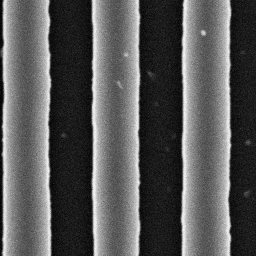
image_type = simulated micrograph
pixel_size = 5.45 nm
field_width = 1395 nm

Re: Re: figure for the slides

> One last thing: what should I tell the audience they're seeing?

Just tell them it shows lines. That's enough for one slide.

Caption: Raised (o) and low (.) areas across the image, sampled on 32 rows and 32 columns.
oooooo......ooooo......oooooo...
oooooo......ooooo......oooooo...
oooooo......ooooo......oooooo...
oooooo......ooooo......oooooo...
oooooo......ooooo......oooooo...
oooooo......ooooo......oooooo...
oooooo......ooooo......oooooo...
oooooo......ooooo......oooooo...
oooooo......ooooo......oooooo...
oooooo......ooooo......oooooo...
oooooo......ooooo......oooooo...
.ooooo......ooooo......oooooo...
.ooooo......ooooo......oooooo...
oooooo......ooooo......oooooo...
oooooo......ooooo......oooooo...
oooooo......ooooo......oooooo...
oooooo......ooooo......oooooo...
oooooo......ooooo......oooooo...
oooooo......ooooo......oooooo...
oooooo......ooooo......oooooo...
oooooo......ooooo......oooooo...
oooooo......ooooo......oooooo...
oooooo......ooooo......oooooo...
oooooo......ooooo......oooooo...
oooooo......ooooo......oooooo...
oooooo......ooooo......oooooo...
oooooo......ooooo......oooooo...
oooooo......ooooo......oooooo...
oooooo......ooooo......oooooo...
oooooo......ooooo......oooooo...
oooooo......ooooo......oooooo...
oooooo......ooooo......oooooo...